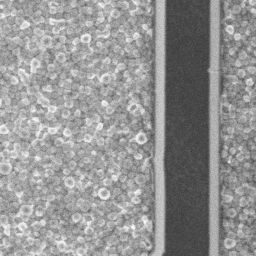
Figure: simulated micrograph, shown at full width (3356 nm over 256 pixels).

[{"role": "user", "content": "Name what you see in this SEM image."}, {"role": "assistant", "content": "one or a few lines or trenches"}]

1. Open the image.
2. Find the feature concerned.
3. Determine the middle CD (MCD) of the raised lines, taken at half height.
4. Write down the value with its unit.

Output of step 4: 713 nanometers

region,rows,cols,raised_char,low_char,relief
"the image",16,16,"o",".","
..........ooo...
..........ooo...
..........ooo...
..........ooo...
..........ooo...
..........ooo...
..........ooo...
..........ooo...
..........ooo...
..........ooo...
..........ooo...
..........ooo...
..........ooo...
..........ooo...
..........ooo...
..........ooo...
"